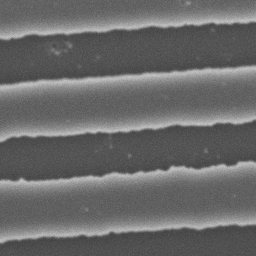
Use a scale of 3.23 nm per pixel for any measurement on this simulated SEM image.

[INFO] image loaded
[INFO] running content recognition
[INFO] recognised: lines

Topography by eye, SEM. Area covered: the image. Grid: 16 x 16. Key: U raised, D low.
UUUUUUUUUUUUUUUU
UUUUUUUUUUUUUDDD
DDDDDDDDDDDDDDDD
DDDDDDDDDDDDDDDD
DDDDDDDDDDDUUUUU
UUUUUUUUUUUUUUUU
UUUUUUUUUUUUUUUU
UUUUUUUUUUUUUUUU
UDDDDDDDDDDDDDDD
DDDDDDDDDDDDDDDD
DDDDDDDDDDDUDUUU
UUUUUUUUUUUUUUUU
UUUUUUUUUUUUUUUU
UUUUUUUUUUUUUUUU
UUUUUUUUDDDDDDDD
DDDDDDDDDDDDDDDD